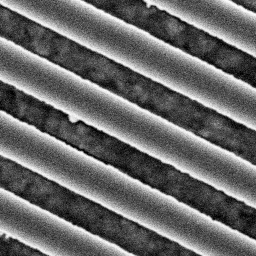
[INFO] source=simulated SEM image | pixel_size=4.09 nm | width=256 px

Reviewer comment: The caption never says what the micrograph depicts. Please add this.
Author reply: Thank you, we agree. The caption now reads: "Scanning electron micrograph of lines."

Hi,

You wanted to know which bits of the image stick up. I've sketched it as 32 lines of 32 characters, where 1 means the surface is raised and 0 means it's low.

11111111111000000001111111111000
00111111111110000000011111111110
00001111111111100000000111111111
00000011111111111000000001111111
00000000111111111110000000011111
11000000001111111111100000000111
11110000000011111111111000000001
11111100000000111111111110000000
11111111000000001111111111100000
11111111110000000011111111111000
01111111111100000000111111111110
00011111111111000000001111111111
00000111111111110000000011111111
00000001111111111100000000111111
10000000011111111111000000001111
11100000000111111111110000000011
11111000000001111111111100000000
11111110000000011111111111000000
11111111100000000111111111110000
11111111111000000001111111111100
00011111111110000000011111111110
00000111111111100000000111111111
00000011111111111000000001111111
00000000111111111110000000011111
11000000000111111111100000000111
11110000000001111111111000000001
11111100000000111111111110000000
11111111000000001111111111100000
11111111110000000011111111111000
01111111111100000000011111111110
00011111111111000000001111111111
00000111111111110000000011111111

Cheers